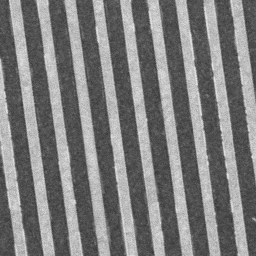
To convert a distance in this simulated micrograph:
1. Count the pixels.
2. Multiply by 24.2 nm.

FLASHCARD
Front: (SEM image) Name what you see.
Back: parallel lines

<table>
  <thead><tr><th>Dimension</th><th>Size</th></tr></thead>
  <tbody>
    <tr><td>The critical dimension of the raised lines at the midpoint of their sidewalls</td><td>237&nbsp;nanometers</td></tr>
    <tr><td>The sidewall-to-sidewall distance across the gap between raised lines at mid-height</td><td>420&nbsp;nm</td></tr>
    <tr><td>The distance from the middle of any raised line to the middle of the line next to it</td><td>0.666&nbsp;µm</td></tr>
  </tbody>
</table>